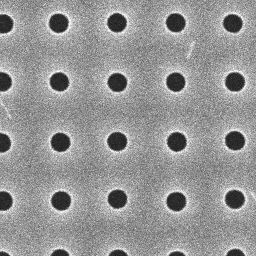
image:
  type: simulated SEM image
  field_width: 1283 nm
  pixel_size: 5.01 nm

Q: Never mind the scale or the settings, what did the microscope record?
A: a regular array of holes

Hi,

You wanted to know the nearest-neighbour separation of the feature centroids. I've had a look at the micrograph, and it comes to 291 nm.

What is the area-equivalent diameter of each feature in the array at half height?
101 nm